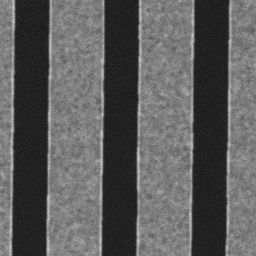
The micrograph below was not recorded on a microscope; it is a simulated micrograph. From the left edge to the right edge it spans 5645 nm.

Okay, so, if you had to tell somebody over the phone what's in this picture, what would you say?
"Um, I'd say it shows wiring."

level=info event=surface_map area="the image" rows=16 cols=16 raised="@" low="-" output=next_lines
@--@@@---@@@--@@
@--@@@---@@@--@@
@--@@@---@@@--@@
@--@@@---@@@--@@
@--@@@---@@@--@@
@--@@@---@@@--@@
@--@@@---@@@--@@
@--@@@---@@@--@@
@--@@@---@@@--@@
@--@@@---@@@--@@
@--@@@---@@@--@@
@--@@@---@@@--@@
@--@@@---@@@--@@
@--@@@---@@@--@@
@--@@@---@@@--@@
@--@@@---@@@--@@